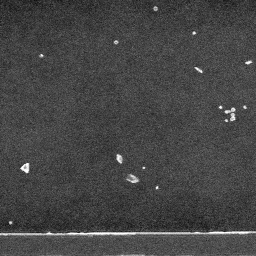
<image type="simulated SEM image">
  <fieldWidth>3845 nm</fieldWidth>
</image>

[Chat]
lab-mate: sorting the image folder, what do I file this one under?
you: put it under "lines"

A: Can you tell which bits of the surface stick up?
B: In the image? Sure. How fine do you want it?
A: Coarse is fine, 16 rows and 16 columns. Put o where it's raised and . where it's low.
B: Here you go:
................
................
................
................
................
................
................
................
................
................
................
................
................
................
................
oooooooooooooooo